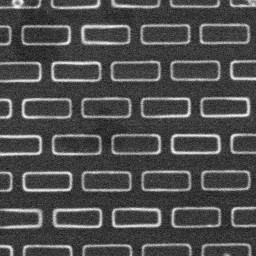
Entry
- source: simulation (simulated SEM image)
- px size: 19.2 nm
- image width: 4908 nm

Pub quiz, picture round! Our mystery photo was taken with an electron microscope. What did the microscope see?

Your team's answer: groups of lines, slits or small figures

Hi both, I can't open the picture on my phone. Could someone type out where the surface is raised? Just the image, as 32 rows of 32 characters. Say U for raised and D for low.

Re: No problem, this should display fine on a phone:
UUUUUDDUUUUUDDUUUUUUDDUUUUUDDUUU
DDDDDDDDDDDDDDDDDDDDDDDDDDDDDDDD
DDDDDDDDDDDDDDDDDDDDDDDDDDDDDDDD
UDDUUUUUDDDUUUUUDDUUUUUDDUUUUUUD
UDDUUUUUUDUUUUUUDDUUUUUUDUUUUUUD
UDDDDDDDDDDDDDDDDDDDDDDDDDDDDDDD
DDDDDDDDDDDDDDDDDDDDDDDDDDDDDDDD
DDDDDDDDDDDDDDDDDDDDDDDDDDDDDDDD
UUUUUDDUUUUUDDUUUUUUDUUUUUUDDUUU
UUUUUDDUUUUUDDUUUUUUDUUUUUUDDUUU
DDDDDDDDDDDDDDDDDDDDDDDDDDDDDDDD
DDDDDDDDDDDDDDDDDDDDDDDDDDDDDDDD
UDDUUUUUDDDUUUUUDDUUUUUDDUUUUUUD
UDDUUUUUUDUUUUUUDDUUUUUUDUUUUUUD
UDDUUUUUUDDUUUUUDDUUUUDDDDUDDDDD
DDDDDDDDDDDDDDDDDDDDDDDDDDDDDDDD
DDDDDDDDDDDDDDDDDDDDDDDDDDDDDDDD
UUUUUDDUUUUUDDUUUUUUDDUUUUUDDUUU
UUUUUDDUUUUUUDUUUUUUDDUUUUUDDUUU
DDDDDDDDDDDDDDDDDDDDDDDDDDDDDDDD
DDDDDDDDDDDDDDDDDDDDDDDDDDDDDDDD
DDDDDDDDDDDDDDDDDDDUUUUDDDUUUUUD
UDDUUUUUUDUUUUUUDDUUUUUUDUUUUUUD
UDDUUUUUUDDUUUUUDDUUUUUUDUUUUUUD
DDDDDDDDDDDDDDDDDDDDDDDDDDDDDDDD
DDDDDDDDDDDDDDDDDDDDDDDDDDDDDDDD
UUUUUDDUUUUUDDUUUUUUDDUUUUUDDUUU
UUUUUDDUUUUUUDUUUUUUDDUUUUUDDUUU
DDDDDDDDDDDDDDDDDDDDDDDDDDDDDDDD
DDDDDDDDDDDDDDDDDDDDDDDDDDDDDDDD
DDDDDDDDDDDDDDDDDDDDDDDDDDDDDDDD
UDDUUUUUUDUUUUUUDDUUUUUUDUUUUUUD